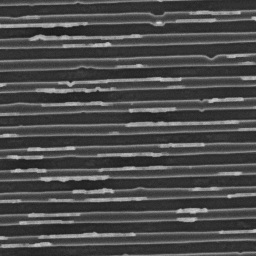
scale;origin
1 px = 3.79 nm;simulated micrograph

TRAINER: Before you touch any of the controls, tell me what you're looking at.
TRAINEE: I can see parallel lines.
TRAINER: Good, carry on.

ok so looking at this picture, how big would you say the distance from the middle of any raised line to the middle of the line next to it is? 0.0833 µm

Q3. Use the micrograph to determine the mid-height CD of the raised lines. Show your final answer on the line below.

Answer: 41.2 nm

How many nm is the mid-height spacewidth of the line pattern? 44.5